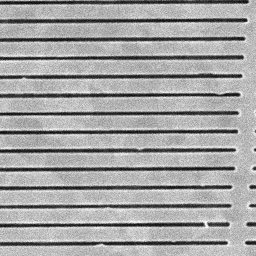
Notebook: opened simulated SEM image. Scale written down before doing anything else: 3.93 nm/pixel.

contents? parallel lines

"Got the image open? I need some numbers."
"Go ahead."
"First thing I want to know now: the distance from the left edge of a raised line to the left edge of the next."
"73 nm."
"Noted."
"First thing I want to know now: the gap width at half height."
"18.2 nanometres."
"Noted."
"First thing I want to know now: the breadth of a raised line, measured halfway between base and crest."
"57.5 nm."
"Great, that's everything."